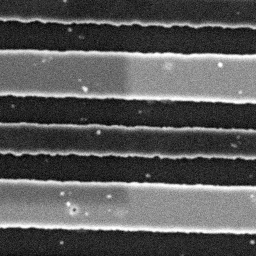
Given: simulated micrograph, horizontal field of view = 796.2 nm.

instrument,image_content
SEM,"lines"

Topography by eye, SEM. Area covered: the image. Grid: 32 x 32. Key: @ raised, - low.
@@@@@@@@@@@@@@@@@@@@@@@@@@@@@@@@
@@@@@@@@@@@@@@@@@@@@@@@@@@@@@@@@
@-@@@@@@@@@@@@@@@@@@@@@@@@@@@@@@
--------------------------------
--------------------------------
--------------------------------
@@@@@@@@@@@@--------------------
@@@@@@@@@@@@@@@@@@@@@@@@@@@@@@@@
@@@@@@@@@@@@@@@@@@@@@@@@@@@@@@@@
@@@@@@@@@@@@@@@@@@@@@@@@@@@@@@@@
@@@@@@@@@@@@@@@@@@@@@@@@@@@@@@@@
@@@@@@@@@@@@@@@@@@@@@@@@@@@@@@@@
-------------------@-@@@@@@@@@@@
--------------------------------
--------------------------------
@@@@@---------------------------
@@@@@@@@@@@@@@@@@@@@@@@@@@@@@@@@
@@@@@@@@@@@@@@@@@@@@@@@@@@@@@@@@
@@@@@@@@@@@@@@@@@@@@@@@@@@@@@@@@
------------@-@@@@@@@@@@@@@@@@@@
--------------------------------
--------------------------------
@@@@----------------------------
@@@@@@@@@@@@@@@@@@@@@@@@@@@@@@@@
@@@@@@@@@@@@@@@@@@@@@@@@@@@@@@@@
@@@@@@@@@@@@@@@@@@@@@@@@@@@@@@@@
@@@@@@@@@@@@@@@@@@@@@@@@@@@@@@@@
@@@@@@@@@@@@@@@@@@@@@@@@@@@@@@@@
-----@-@@@@@@@@@@@@@@@@@@@@@@@@@
--------------------------------
--------------------------------
--------------------------------